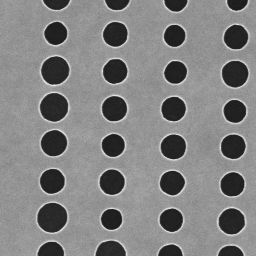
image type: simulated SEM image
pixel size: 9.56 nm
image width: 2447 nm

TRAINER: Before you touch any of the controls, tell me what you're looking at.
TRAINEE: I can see a regular array of holes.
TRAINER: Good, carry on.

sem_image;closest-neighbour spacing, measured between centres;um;0.352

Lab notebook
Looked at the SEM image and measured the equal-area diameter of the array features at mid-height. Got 234 nm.